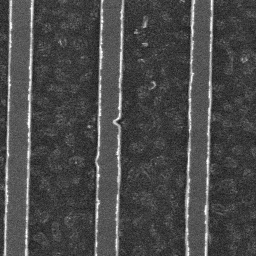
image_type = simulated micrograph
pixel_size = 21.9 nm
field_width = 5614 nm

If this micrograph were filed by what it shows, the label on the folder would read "one or a few lines or trenches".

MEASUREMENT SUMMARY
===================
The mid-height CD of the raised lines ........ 493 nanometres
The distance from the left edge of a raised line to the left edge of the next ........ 1980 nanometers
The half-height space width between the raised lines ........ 1.49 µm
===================